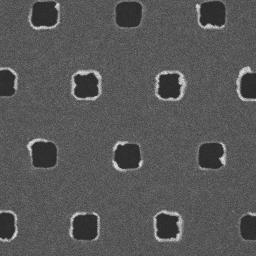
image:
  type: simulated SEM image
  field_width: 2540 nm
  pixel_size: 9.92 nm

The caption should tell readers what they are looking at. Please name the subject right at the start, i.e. a regular array of holes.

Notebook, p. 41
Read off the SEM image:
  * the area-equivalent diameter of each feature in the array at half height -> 0.267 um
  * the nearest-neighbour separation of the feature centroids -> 802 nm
